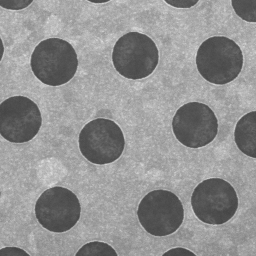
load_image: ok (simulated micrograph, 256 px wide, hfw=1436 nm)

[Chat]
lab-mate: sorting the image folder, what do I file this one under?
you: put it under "a regular array of holes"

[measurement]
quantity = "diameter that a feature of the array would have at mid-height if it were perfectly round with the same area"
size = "0.264 um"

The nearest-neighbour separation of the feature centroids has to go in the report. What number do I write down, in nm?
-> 421